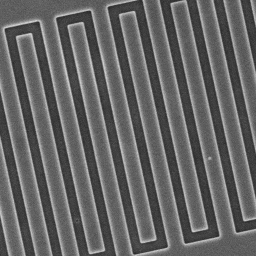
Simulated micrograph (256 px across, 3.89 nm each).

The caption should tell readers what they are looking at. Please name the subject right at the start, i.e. groups of lines, slits or small figures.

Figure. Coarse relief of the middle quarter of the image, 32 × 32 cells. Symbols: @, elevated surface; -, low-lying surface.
---@@@@---@@@@--@@@@@--@@@@---@@
@--@@@@---@@@@---@@@@--@@@@@--@@
@---@@@---@@@@---@@@@---@@@@--@@
@---@@@@--@@@@@--@@@@---@@@@---@
@---@@@@---@@@@--@@@@@--@@@@---@
@---@@@@---@@@@---@@@@--@@@@---@
@@--@@@@---@@@@---@@@@--@@@@@--@
@@---@@@@--@@@@---@@@@---@@@@--@
@@---@@@@---@@@---@@@@---@@@@---
@@---@@@@---@@@@--@@@@@--@@@@---
@@@--@@@@---@@@@---@@@@--@@@@@--
@@@--@@@@---@@@@---@@@@---@@@@--
@@@---@@@@--@@@@---@@@@---@@@@--
@@@---@@@@---@@@@--@@@@---@@@@--
@@@---@@@@---@@@@---@@@@--@@@@--
@@@@--@@@@---@@@@---@@@@--@@@@--
@@@@--@@@@@--@@@@---@@@@---@@@@-
@@@@---@@@@--@@@@---@@@@---@@@@-
@@@@---@@@@---@@@@--@@@@---@@@@-
@@@@---@@@@---@@@@--@@@@@--@@@@-
-@@@@--@@@@---@@@@---@@@@---@@@@
-@@@@--@@@@@--@@@@---@@@@---@@@@
-@@@@---@@@@--@@@@@--@@@@---@@@@
-@@@@---@@@@---@@@@--@@@@@--@@@@
-@@@@---@@@@---@@@@---@@@@--@@@@
--@@@@--@@@@---@@@@---@@@@--@@@@
--@@@@---@@@@--@@@@@--@@@@---@@@
--@@@@---@@@@---@@@@--@@@@---@@@
--@@@@---@@@@---@@@@--@@@@@--@@@
---@@@@--@@@@---@@@@---@@@@--@@@
---@@@@--@@@@---@@@@---@@@@---@@
---@@@@---@@@@--@@@@---@@@@---@@